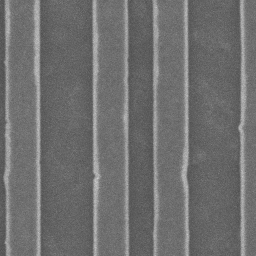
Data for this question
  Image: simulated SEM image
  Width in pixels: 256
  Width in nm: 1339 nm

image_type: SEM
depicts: one or a few lines or trenches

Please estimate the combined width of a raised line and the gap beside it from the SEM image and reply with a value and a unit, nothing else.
387 nm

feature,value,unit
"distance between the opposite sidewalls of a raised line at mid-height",165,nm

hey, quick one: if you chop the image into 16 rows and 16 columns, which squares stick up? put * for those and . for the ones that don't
**....**..**...*
**....**..**...*
**....**..**...*
**....**..**...*
**....**..**...*
**....**..**...*
**....**..**...*
**....**..**...*
**....**..**...*
**....**..**...*
**....**..**...*
**....**..**...*
**....**..**...*
**....**..**...*
.*....**..**...*
**....**..**...*